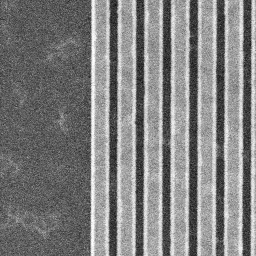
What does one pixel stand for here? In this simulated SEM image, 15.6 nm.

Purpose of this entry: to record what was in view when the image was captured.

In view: parallel lines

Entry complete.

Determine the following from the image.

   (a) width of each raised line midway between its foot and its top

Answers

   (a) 252 nm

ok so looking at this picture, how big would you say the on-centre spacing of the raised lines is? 416 nanometers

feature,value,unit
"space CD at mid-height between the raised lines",172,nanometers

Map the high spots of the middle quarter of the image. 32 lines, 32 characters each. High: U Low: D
DDDDDDDUUUUDDDUUUUDDDUUUDDDUUUUD
DDDDDDDUUUUDDDUUUUDDDUUUDDDUUUUD
DDDDDDDUUUUDDDUUUUDDDUUUDDDUUUUD
DDDDDDDUUUUDDDUUUUDDDUUUDDDUUUUD
DDDDDDDUUUUDDDUUUUDDDUUUDDDUUUUD
DDDDDDDUUUUDDDUUUUDDDUUUDDDUUUUD
DDDDDDDUUUUDDDUUUUDDDUUUDDDUUUUD
DDDDDDDUUUUDDDUUUUDDDUUUDDDUUUUD
DDDDDDDUUUUDDDUUUUDDDUUUDDDUUUUD
DDDDDDDUUUUDDDUUUUDDDUUUDDDUUUUD
DDDDDDDUUUUDDDUUUUDDDUUUDDDUUUUD
DDDDDDDUUUUDDDUUUUDDDUUUDDDUUUUD
DDDDDDDUUUUDDDUUUUDDDUUUDDDUUUUD
DDDDDDDUUUUDDDUUUUDDDUUUDDDUUUUD
DDDDDDDUUUUDDDUUUUDDDUUUDDDUUUUD
DDDDDDDUUUUDDDUUUUDDDUUUDDDUUUUD
DDDDDDDUUUUDDDUUUUDDDUUUDDDUUUUD
DDDDDDDUUUUDDDUUUUDDDUUUDDDUUUUD
DDDDDDDUUUUDDDUUUDDDDUUUDDDUUUUD
DDDDDDDUUUUDDDUUUDDDDUUUDDDUUUUD
DDDDDDDUUUUDDDUUUDDDDUUUDDDUUUUD
DDDDDDDUUUUDDDUUUDDDDUUUDDDUUUUD
DDDDDDDUUUUDDDUUUDDDUUUUDDDUUUUD
DDDDDDDUUUUDDDUUUDDDUUUUDDDUUUUD
DDDDDDDUUUUDDDUUUDDDUUUUDDDUUUUD
DDDDDDDUUUUDDDUUUDDDUUUUDDDUUUUD
DDDDDDDUUUUDDDUUUDDDUUUUDDDUUUUD
DDDDDDDUUUUDDDUUUDDDUUUUDDDUUUUD
DDDDDDDUUUUDDDUUUDDDUUUUDDDUUUUD
DDDDDDDUUUUDDDUUUDDDUUUUDDDUUUUD
DDDDDDDUUUUDDDUUUDDDUUUUDDDUUUUD
DDDDDDDUUUUDDDUUUDDDUUUUDDDUUUUD